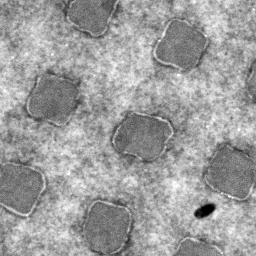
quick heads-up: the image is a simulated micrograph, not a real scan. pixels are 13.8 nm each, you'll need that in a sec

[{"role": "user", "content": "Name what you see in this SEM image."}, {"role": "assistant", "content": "raised bodies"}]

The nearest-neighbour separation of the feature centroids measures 1340 nm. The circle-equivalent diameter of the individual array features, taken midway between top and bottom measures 674 nm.